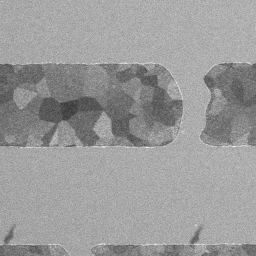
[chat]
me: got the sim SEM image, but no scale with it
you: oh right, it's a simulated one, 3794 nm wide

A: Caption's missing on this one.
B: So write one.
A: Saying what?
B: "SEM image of one or a few lines or trenches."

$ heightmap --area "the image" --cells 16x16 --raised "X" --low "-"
----------------
----------------
----------------
----------------
XXXXXXXXXXX--XXX
XXXXXXXXXXX--XXX
XXXXXXXXXXX--XXX
XXXXXXXXXXX--XXX
XXXXXXXXXXX--XXX
----------------
----------------
----------------
----------------
----------------
----------------
XXXX--XXXXXXXXXX